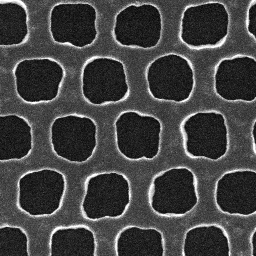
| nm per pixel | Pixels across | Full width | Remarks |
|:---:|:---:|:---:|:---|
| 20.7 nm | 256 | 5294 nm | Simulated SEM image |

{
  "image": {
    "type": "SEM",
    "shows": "a regular array of holes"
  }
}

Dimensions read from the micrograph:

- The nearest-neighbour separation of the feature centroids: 63.9 px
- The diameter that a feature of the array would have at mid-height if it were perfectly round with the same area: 977 nm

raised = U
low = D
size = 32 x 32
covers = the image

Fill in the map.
DDUUUUUUDDDUUUUUUUUUUUUUUUDDUUUD
DDDUUUDDDDDDUUUDDDDDUUUDDDDDUUUD
DDDUUUDDDDDDUUDDDDDDUUUDDDDDDUUD
DDDUUUDDDDDDUUDDDDDDUUUDDDDDUUUD
DDDUUUUDDDDDUUDDDDDDUUUDDDDDUUUU
DDUUUUUUUDDUUUUDDDDDUUUDDDDUUUUU
UUUUUUUUUUUUUUUUUUUUUUUUUUUUUUUU
UUUDDDUUUUUUDDUUUUUDDDDUUUUUDDDD
UUDDDDDDUUUDDDDUUUUDDDDDUUUDDDDD
UUDDDDDDUUDDDDDDUUDDDDDDUUUDDDDD
UUDDDDDUUUDDDDDDUUUDDDDDUUUDDDDD
UUDDDDDUUUDDDDDDUUUDDDDDUUUDDDDD
UUUDDDUUUUUDDDDUUUUUUDDUUUUUUUDD
UUUUUUUUUUUUUUUUUUUUUUUUUUUUUUUU
UDUUUUUUDUUUUUUDDDDUUUUUDDDDUUUU
DDDDUUUDDDDDUUDDDDDDUUUDDDDDUUUU
DDDDUUDDDDDDUUUDDDDDUUUDDDDDUUUU
DDDDUUDDDDDDUUUDDDDDUUUDDDDDDUUU
DDDDUUUDDDDDUUUDDDDDUUUDDDDDUUUU
DDDUUUUUDDDUUUUUDDDUUUUUDDDDUUUU
UUUUUUUUUUUUUUUUUUUUUUUUUUUUUUUU
UUUUDDDUUUUUUUUUUUUUUDDDUUUUUDDD
UUUDDDDDUUUDDDDDUUUDDDDDUUUDDDDD
UUDDDDDDUUUDDDDDUUUDDDDDUUUDDDDD
UUDDDDDDUUUDDDDDUUUDDDDDDUUDDDDD
UUDDDDDUUUDDDDDDUUUDDDDDUUUDDDDD
UUUDDDDUUUDDDDDUUUUUDDDUUUUUDDDD
UUUUUUUUUUUUUUUUUUUUUUUUUUUUUUUU
DDUUUUUUDDDUUUUUDUUUUUUUDDDDUUUU
DDDUUUUDDDDDUUUDDDDDUUUDDDDDUUUU
DDDUUUDDDDDDUUUDDDDDUUUDDDDDDUUU
DDDUUUDDDDDDUUUDDDDDUUUDDDDDDUUU